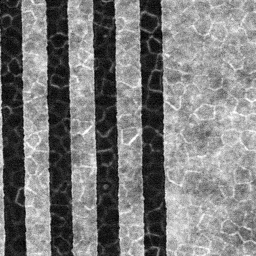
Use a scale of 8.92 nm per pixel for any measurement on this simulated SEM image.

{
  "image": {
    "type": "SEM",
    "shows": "parallel lines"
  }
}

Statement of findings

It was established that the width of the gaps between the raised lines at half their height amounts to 202 nm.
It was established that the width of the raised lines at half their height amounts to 0.213 micrometres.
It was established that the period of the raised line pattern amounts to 415 nm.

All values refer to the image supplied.